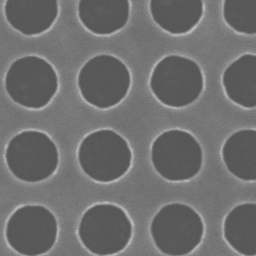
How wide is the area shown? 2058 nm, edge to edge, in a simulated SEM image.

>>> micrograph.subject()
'holes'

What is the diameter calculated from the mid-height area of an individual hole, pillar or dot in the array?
412 nanometers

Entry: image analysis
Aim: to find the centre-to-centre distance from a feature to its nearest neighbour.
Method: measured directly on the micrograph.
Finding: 0.586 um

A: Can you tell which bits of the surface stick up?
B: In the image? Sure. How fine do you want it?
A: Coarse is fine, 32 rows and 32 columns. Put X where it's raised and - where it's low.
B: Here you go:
X------XXX------XXX------XXX----
X------XXX------XXX------XXX----
X------XXX------XXX------XXX----
XX----XXXXX----XXXXX----XXXXX---
XXXXXXXXXXXXXXXXXXXXXXXXXXXXXXXX
XXXXXXXXXXXXXXXXXXXXXXXXXXXXXXXX
XXXXXXXXXXXXXXXXXXXXXXXXXXXXXXXX
XX---XXXXXX----XXXXX----XXXXX---
X-----XXXX------XXX------XXX----
X------XXX------XXX------XXX----
X------XXX------XXX------XXX----
X------XXX------XXX------XXX----
XX----XXXXX----XXXXX----XXXXX---
XXXXXXXXXXXXXXXXXXXXXXXXXXXXXXXX
XXXXXXXXXXXXXXXXXXXXXXXXXXXXXXXX
XXXXXXXXXXXXXXXXXXXXXXXXXXXXXXXX
XXX--XXXXXXX--XXXXXXX--XXXXXXX--
X-----XXXXX----XXXX-----XXXX----
X------XXX------XXX------XXX----
X------XXX------XXX------XXX----
X------XXX------XXX------XXX----
XX-----XXXX-----XXXX-----XXXX---
XXX--XXXXXXX--XXXXXXX--XXXXXXXXX
XXXXXXXXXXXXXXXXXXXXXXXXXXXXXXXX
XXXXXXXXXXXXXXXXXXXXXXXXXXXXXXXX
XXXXXXXXXXXXXXXXXXXXX--XXXXXXXX-
XX----XXXXX----XXXXX----XXXXX---
X------XXX------XXX------XXX----
X------XXX------XXX------XXX----
X------XXX------XXX------XXX----
X------XXX------XXX------XXXX---
XX----XXXXX----XXXXX----XXXXXX--